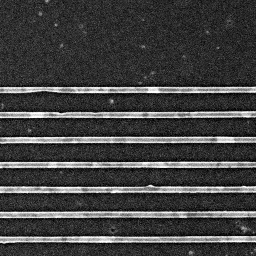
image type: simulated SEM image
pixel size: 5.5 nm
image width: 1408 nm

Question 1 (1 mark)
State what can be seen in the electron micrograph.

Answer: parallel lines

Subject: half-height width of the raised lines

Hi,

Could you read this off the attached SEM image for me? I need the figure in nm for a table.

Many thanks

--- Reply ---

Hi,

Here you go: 30.3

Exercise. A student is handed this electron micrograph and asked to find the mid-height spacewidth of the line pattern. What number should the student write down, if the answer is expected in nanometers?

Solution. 107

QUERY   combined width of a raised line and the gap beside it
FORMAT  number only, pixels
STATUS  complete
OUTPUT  25